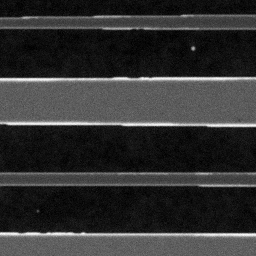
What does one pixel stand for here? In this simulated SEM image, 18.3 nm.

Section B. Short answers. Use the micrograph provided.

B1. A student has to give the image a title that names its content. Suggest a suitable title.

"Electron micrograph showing lines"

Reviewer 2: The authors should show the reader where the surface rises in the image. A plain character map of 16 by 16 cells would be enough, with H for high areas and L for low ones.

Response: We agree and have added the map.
LLLLLLLLLLLLLLLL
LLLLLLLLLLLLLLLL
LLLLLLLLLLLLLLLL
LLLLLLLLLLLLLLLL
LLLLLLLLLLLLLLLL
HHHHHHHHHHHHHHHH
HHHHHHHHHHHHHHHH
HHHHHHHHHHHHHHHH
LLLLLLLLLLLLLLLL
LLLLLLLLLLLLLLLL
LLLLLLLLLLLLLLLL
LLLLLLLLLLLLLLLL
LLLLLLLLLLLLLLLL
LLLLLLLLLLLLLLLL
LLLLLLLLLLLLLLLL
HHHHHHHHHHHHHHHH